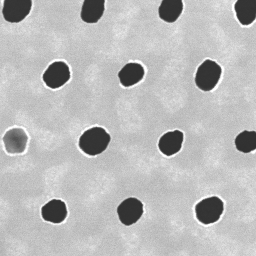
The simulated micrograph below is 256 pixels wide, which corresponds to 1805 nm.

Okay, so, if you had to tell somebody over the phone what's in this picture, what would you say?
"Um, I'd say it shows a regular array of holes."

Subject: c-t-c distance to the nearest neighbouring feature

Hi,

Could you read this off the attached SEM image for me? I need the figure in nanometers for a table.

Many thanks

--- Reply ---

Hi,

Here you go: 536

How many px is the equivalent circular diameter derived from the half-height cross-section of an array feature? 26.5